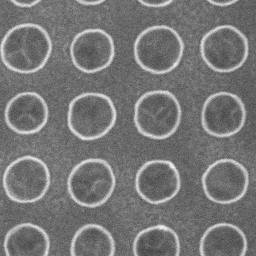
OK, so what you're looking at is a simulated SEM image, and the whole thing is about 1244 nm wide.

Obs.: a regular array of raised bodies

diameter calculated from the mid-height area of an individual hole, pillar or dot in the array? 221 nm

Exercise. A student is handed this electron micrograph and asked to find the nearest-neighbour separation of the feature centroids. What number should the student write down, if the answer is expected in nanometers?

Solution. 316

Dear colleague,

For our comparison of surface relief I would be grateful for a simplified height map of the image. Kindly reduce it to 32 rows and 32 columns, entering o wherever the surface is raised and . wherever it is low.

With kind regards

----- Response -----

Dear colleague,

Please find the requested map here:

..oo..............ooo......o....
................................
................................
..ooo..............oo......oo...
.ooooo....oooo...ooooo....oooo..
oooooo...ooooo...oooooo..oooooo.
oooooo...ooooo...oooooo..oooooo.
oooooo...ooooo...ooooo....ooooo.
.oooo.....ooo.....oooo.....ooo..
................................
................................
...................oo...........
..ooo....ooooo...ooooo....oooo..
.ooooo...ooooo...ooooo...ooooo..
.ooooo...ooooo...ooooo...oooooo.
.oooo....ooooo...ooooo...ooooo..
..oo.....oooo.....oooo....ooo...
................................
................................
................................
.oooo.....ooo.....ooo......ooo..
.ooooo...ooooo...ooooo....ooooo.
.ooooo...ooooo...ooooo...oooooo.
.ooooo...ooooo...ooooo...oooooo.
.oooo....ooooo....oooo....oooo..
..........oo....................
................................
................................
..ooo.....ooo......oo.....oooo..
.ooooo...ooooo...ooooo...ooooo..
.ooooo...ooooo...ooooo...oooooo.
.ooooo...ooooo...ooooo...ooooo..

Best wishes